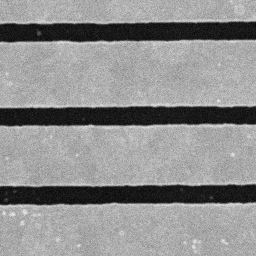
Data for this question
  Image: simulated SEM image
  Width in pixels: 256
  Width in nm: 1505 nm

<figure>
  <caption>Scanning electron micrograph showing lines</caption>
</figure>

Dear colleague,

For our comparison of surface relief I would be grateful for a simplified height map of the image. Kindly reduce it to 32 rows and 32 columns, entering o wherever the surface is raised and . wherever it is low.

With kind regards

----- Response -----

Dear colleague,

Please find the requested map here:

oooooooooooooooooooooooooooooooo
oooooooooooooooooooooooooooooooo
oooooooooooooooooooooooooooooooo
................................
................................
oooooooooooooooooooooooooooooooo
oooooooooooooooooooooooooooooooo
oooooooooooooooooooooooooooooooo
oooooooooooooooooooooooooooooooo
oooooooooooooooooooooooooooooooo
oooooooooooooooooooooooooooooooo
oooooooooooooooooooooooooooooooo
oooooooooooooooooooooooooooooooo
................................
................................
................................
oooooooooooooooooooooooooooooooo
oooooooooooooooooooooooooooooooo
oooooooooooooooooooooooooooooooo
oooooooooooooooooooooooooooooooo
oooooooooooooooooooooooooooooooo
oooooooooooooooooooooooooooooooo
oooooooooooooooooooooooooooooooo
................................
................................
..............o......oo.....oo.o
oooooooooooooooooooooooooooooooo
oooooooooooooooooooooooooooooooo
oooooooooooooooooooooooooooooooo
oooooooooooooooooooooooooooooooo
oooooooooooooooooooooooooooooooo
oooooooooooooooooooooooooooooooo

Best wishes